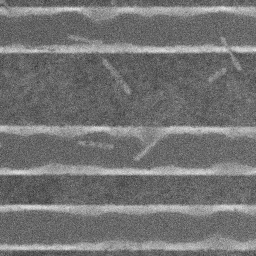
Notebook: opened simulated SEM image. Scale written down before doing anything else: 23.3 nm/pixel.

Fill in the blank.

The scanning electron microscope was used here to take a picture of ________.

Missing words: lines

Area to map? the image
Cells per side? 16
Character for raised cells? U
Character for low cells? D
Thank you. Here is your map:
DDDDDDDDDDDDDDDD
UUUUUUUUUUUUUUUU
UUUUUUUUUUUUUUUU
DDDDDDDDDDDDDDDD
DDDDDDDDDDDDDDDD
DDDDDDDDDDDDDDDD
DDDDDDDDDDDDDDDD
DDDDDDDDDDDDDDDD
UUUUUUUUUUUUUUUU
UUUUUUUUUUUUUUUU
UUUUUUUUUUUUUUUU
DDDDDDDDDDDDDDDD
DDDDDDDDDDDDDDDD
UUUUUUUUUUUUUUUU
UUUUUUUUUUUUUUUU
DDDDDDDDDDDDDDDD